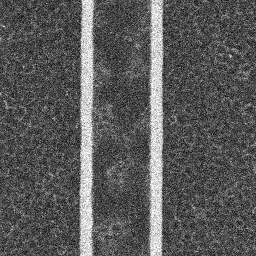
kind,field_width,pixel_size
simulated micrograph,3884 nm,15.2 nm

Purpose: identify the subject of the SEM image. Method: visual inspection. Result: one or a few lines or trenches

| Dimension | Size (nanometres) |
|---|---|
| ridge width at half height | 1040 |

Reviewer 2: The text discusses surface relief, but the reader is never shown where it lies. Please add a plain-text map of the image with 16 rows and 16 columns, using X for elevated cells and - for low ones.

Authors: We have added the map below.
------XXXX------
-----XXXXX------
-----XXXXX------
-----XXXXX------
------XXXX------
------XXXX------
-----XXXXX------
-----XXXXX------
-----XXXXX------
-----XXXXX------
-----XXXXX------
-----XXXXX------
-----XXXXX------
-----XXXXX------
-----XXXXX------
-----XXXXX------